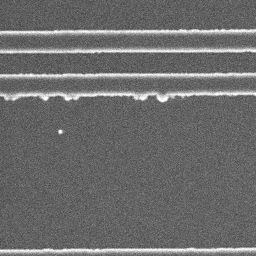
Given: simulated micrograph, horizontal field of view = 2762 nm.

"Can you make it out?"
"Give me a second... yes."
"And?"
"lines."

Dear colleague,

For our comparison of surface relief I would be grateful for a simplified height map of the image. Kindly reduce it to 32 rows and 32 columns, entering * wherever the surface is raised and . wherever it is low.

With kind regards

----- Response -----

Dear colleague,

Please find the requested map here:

................................
................................
................................
................................
********************************
********************************
************....................
................................
................................
********************************
********************************
********************************
....................*...........
................................
................................
................................
................................
................................
................................
................................
................................
................................
................................
................................
................................
................................
................................
................................
................................
................................
................................
********************************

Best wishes